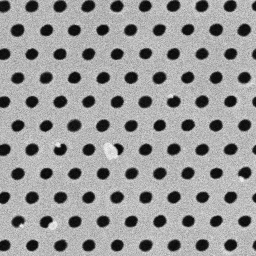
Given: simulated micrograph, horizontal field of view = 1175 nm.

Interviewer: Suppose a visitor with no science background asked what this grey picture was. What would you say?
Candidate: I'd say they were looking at a regular array of holes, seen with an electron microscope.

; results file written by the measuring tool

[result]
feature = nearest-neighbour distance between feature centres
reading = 126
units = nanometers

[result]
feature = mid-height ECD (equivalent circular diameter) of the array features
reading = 56.8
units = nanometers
